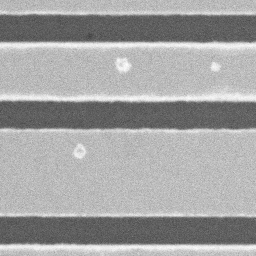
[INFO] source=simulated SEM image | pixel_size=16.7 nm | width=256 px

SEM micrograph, lines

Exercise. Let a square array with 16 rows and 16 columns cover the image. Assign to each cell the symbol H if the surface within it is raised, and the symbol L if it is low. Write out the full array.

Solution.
HHHHHHHHHHHHHHHH
LLLLLLLLLLLLLLLL
LLLLLLLLLLLLLLLL
HHHHHHHHHHHHHHHH
HHHHHHHHHHHHHHHH
HHHHHHHHHHHHHHHH
LLLLLLLLLLLLLLLL
LLLLLLLLLLLLLLLL
HHHHHHHHHHHHHHHH
HHHHHHHHHHHHHHHH
HHHHHHHHHHHHHHHH
HHHHHHHHHHHHHHHH
HHHHHHHHHHHHHHHH
LLLLLLLLLLLLLLLL
LLLLLLLLLLLLLLLL
HHHHHHHHHHHHHHHH